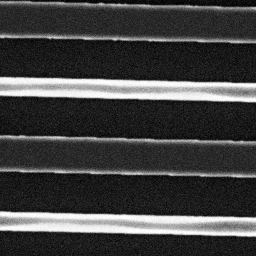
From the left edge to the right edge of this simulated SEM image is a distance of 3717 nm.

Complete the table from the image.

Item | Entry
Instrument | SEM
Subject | lines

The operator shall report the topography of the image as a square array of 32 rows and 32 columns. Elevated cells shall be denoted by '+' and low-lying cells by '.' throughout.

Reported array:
+++++++++++++...................
++++++++++++++++++++++++++++++++
++++++++++++++++++++++++++++++++
++++++++++++++++++++++++++++++++
++++++++++++++++++++++++++++++++
................................
................................
................................
................................
................................
+++++++++++++++++++++++++++++...
++++++++++++++++++++++++++++++++
..............................++
................................
................................
................................
................................
+++++++++++++++++++.............
++++++++++++++++++++++++++++++++
++++++++++++++++++++++++++++++++
++++++++++++++++++++++++++++++++
......++++++++++++++++++++++++++
................................
................................
................................
................................
................................
++++++++++++++++++++++++++++++++
++++++++++++++++++++++++++++++++
................................
................................
................................